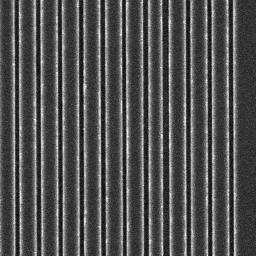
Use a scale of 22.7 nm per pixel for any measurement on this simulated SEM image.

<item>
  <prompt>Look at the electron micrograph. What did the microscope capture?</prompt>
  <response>parallel lines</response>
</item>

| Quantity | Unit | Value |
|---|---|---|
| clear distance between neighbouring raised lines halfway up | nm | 105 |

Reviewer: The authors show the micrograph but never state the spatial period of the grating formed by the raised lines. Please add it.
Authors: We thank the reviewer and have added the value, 0.486 microns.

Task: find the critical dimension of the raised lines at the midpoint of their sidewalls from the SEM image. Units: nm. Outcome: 375